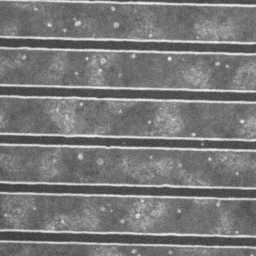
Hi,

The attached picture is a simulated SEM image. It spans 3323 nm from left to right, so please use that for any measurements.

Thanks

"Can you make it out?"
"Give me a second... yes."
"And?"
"parallel lines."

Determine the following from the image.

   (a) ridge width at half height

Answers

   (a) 498 nm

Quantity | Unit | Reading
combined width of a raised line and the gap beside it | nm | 627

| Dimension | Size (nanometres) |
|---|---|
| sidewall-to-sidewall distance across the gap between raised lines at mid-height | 131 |